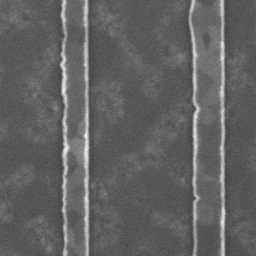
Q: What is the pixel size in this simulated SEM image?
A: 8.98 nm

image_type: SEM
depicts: one or a few lines or trenches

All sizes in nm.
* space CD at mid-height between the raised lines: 963